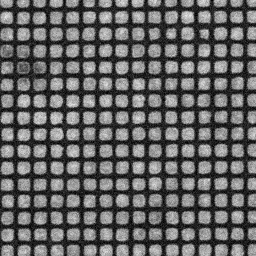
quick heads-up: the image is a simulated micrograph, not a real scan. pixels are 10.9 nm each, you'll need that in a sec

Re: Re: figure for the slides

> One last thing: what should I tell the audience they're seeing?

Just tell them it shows a regular array of raised bodies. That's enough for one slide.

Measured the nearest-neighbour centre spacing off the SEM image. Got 177 nanometers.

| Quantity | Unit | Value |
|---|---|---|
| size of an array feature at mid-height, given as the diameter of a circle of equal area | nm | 138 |